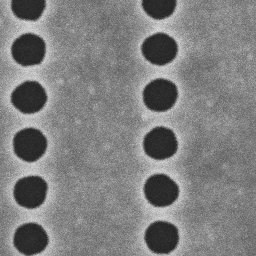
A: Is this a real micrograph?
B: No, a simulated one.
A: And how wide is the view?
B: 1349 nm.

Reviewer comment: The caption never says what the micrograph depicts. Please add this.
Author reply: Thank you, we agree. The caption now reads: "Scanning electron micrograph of a regular array of holes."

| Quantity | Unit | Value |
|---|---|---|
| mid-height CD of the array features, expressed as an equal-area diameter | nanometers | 183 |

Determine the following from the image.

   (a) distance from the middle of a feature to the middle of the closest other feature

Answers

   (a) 247 nm